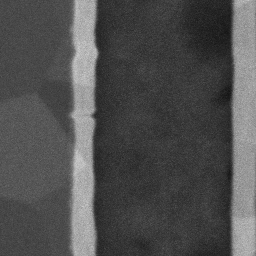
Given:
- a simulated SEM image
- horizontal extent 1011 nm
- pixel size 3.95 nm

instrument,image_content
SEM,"one or a few lines or trenches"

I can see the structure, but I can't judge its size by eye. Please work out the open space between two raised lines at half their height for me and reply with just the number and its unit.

647 nm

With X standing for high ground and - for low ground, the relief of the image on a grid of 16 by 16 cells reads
XXXXX----------X
XXXXX----------X
XXXXX----------X
XXXXX----------X
XXXXX----------X
XXXXX----------X
XXXXX----------X
XXXXX----------X
XXXXX----------X
XXXXX----------X
XXXXX----------X
XXXXX----------X
XXXXX----------X
XXXXX----------X
XXXXX----------X
XXXXX----------X